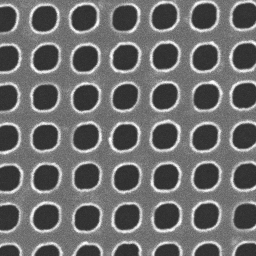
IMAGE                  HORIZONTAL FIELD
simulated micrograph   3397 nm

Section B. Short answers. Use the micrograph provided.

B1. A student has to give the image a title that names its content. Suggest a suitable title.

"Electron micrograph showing a regular array of holes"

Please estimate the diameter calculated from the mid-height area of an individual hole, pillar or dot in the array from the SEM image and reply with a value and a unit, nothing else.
348 nm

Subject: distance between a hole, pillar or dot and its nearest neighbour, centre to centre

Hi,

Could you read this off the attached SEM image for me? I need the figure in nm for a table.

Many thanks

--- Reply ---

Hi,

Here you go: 522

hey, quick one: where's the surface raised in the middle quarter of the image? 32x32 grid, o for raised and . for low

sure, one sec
oo......oooo......ooooo....ooooo
ooo....ooooooo..oooooooo.ooooooo
oooooooooooooooooooooooooooooooo
oooooooooooooooooooooooooooooooo
oooooooooooooooooooooooooooooooo
oooo...ooooooo....oooooo....oooo
ooo......oooo.....ooooo.....oooo
oo.......ooo.......ooo.......ooo
oo.......ooo......oooo......oooo
oo......oooo......oooo......oooo
ooo.....oooo.....ooooo.....ooooo
ooo....ooooooo.ooooooooooooooooo
oooooooooooooooooooooooooooooooo
oooooooooooooooooooooooooooooooo
oooooooooooooooooooooooooooooooo
oooo....oooooo....ooooo.....oooo
ooo......oooo.....oooo......oooo
oo.......ooo......oooo......oooo
oo.......ooo.......ooo......oooo
oo......oooo......oooo......oooo
ooo.....oooo......ooooo....ooooo
oooo.ooooooooo.ooooooooooooooooo
oooooooooooooooooooooooooooooooo
oooooooooooooooooooooooooooooooo
oooooooooooooooooooooooooooooooo
oooo....oooooo....oooooo....oooo
ooo......oooo......oooo.....oooo
ooo......oooo......ooo.......ooo
oo.......ooo.......ooo.......ooo
oo.......ooo.......ooo.......ooo
ooo.....ooooo.....ooooo.....oooo
oooooooooooooo...ooooooooooooooo